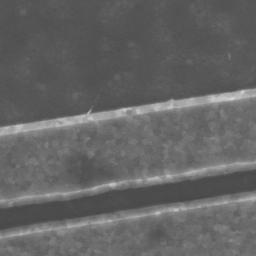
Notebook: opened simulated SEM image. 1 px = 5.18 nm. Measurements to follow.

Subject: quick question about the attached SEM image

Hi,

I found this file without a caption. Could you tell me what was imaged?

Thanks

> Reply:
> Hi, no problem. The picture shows one or a few lines or trenches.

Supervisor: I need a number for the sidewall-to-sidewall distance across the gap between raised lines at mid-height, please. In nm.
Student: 142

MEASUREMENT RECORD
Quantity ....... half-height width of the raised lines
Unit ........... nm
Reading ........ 384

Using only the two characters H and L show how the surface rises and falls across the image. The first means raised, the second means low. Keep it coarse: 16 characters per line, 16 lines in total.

LLLLLLLLLLLLLLLL
LLLLLLLLLLLLLLLL
LLLLLLLLLLLLLLLL
LLLLLLLLLLLLLLLL
LLLLLLLLLLLLLLLL
LLLLLLLLLLLLLLLL
LLLLLLLLLLLHHHHH
LLLLLHHHHHHHHHHH
HHHHHHHHHHHHHHHH
HHHHHHHHHHHHHHHH
HHHHHHHHHHHHHHHL
HHHHHHHHHLLLLLLL
HHHLLLLLLLLLLLHH
LLLLLLLHHHHHHHHH
LHHHHHHHHHHHHHHH
HHHHHHHHHHHHHHHH